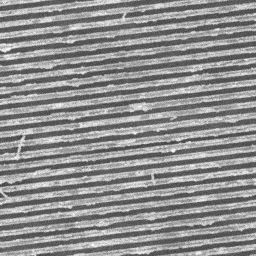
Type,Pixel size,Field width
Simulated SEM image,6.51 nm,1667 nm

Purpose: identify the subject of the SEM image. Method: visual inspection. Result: parallel lines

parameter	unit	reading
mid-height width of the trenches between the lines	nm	37.9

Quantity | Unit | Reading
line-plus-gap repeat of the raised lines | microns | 0.071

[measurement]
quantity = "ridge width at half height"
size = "4.96 px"